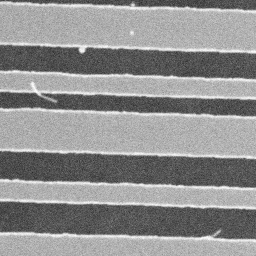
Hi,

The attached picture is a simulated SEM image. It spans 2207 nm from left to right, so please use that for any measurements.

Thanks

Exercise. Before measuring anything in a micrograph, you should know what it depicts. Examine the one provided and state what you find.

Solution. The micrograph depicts lines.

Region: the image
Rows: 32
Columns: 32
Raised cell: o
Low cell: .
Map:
oooo............................
oooooooooooooooooooooooooooooooo
oooooooooooooooooooooooooooooooo
oooooooooooooooooooooooooooooooo
oooooooooooooooooooooooooooooooo
..oooooooooooooooooooooooooooooo
...............................o
................................
................................
ooooooooooooooooo...............
oooooooooooooooooooooooooooooooo
....oooooooooooooooooooooooooooo
................................
................................
ooooooooooooooooooooooooooo.....
oooooooooooooooooooooooooooooooo
oooooooooooooooooooooooooooooooo
oooooooooooooooooooooooooooooooo
oooooooooooooooooooooooooooooooo
.......................ooooooooo
................................
................................
o...............................
oooooooooooooooooooooooooooooo..
oooooooooooooooooooooooooooooooo
.............ooooooooooooooooooo
................................
................................
................................
oooooooooooooooo................
oooooooooooooooooooooooooooooooo
oooooooooooooooooooooooooooooooo